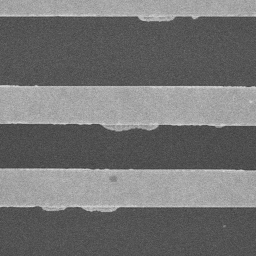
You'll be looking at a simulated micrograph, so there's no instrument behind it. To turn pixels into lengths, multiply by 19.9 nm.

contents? lines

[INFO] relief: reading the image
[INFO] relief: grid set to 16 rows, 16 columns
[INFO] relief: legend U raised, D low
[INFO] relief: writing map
UUUUUUUUUUUUUUUU
DDDDDDDDDDDDDDDD
DDDDDDDDDDDDDDDD
DDDDDDDDDDDDDDDD
DDDDDDDDDDDDDDDD
UUUUUUUUUUUUUUUU
UUUUUUUUUUUUUUUU
UUUUUUUUUUUUUUUU
DDDDDDDDDDDDDDDD
DDDDDDDDDDDDDDDD
DDDDDDDDDDDDDDDD
UUUUUUUUUUUUUUUU
UUUUUUUUUUUUUUUU
DDDDDDDDDDDDDDDD
DDDDDDDDDDDDDDDD
DDDDDDDDDDDDDDDD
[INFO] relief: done